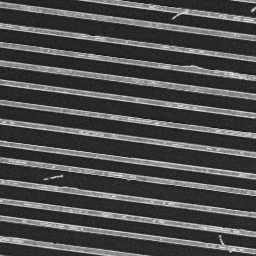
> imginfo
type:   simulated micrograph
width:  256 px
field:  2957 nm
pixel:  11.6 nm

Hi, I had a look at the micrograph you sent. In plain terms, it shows parallel lines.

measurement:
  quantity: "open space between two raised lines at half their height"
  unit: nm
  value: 170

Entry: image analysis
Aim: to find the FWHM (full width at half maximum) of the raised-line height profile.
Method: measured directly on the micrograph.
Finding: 50.1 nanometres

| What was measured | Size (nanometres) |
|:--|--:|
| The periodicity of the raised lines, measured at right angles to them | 222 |